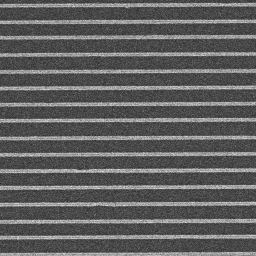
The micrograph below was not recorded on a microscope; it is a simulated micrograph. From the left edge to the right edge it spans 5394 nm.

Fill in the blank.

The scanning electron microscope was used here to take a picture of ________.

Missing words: parallel lines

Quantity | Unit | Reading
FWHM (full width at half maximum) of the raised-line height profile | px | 2.75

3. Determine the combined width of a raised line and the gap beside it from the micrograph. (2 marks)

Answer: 0.349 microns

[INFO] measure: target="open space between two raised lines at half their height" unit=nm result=292